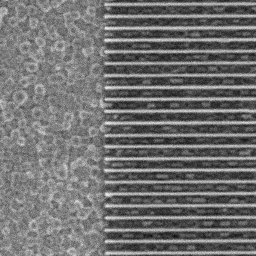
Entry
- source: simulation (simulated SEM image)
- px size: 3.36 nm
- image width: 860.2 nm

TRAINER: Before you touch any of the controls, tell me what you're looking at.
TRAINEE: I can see parallel lines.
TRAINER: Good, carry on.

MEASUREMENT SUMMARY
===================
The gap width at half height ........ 32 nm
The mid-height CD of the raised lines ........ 8.8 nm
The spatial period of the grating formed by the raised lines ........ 39.9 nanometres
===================